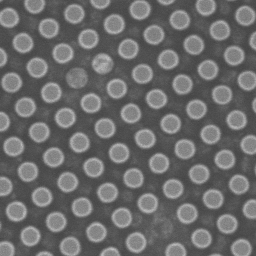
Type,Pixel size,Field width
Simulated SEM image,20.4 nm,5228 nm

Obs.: a regular array of raised bodies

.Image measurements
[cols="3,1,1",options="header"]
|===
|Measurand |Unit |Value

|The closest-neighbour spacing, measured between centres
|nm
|585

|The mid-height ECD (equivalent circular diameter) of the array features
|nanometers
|386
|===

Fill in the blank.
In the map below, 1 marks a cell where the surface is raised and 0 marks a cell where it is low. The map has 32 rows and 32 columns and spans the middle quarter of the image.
00000000011000000001100011110000
00000000111000000011110000000000
00000000000000000111110000000000
00000000000000000111110000001110
00000000000011100001100000011111
00000000000111100000000000011111
00000000000111100000001100001111
00000000000111100000011110000000
00000111100000000000011110000000
00001111100000000000011110000000
00001111100000011100001100000001
11000111000000111110000000000001
11000000000000111110000000000001
11100000000000011110000001111000
11000000111100001100000011111000
10000000111110000000000011111000
00000000111110000000100001110000
00011000111100000011110000000000
00111100000000000011111000000000
00111100000000000011111000000111
00111100000011100001110000001111
00011000000011110000000000001111
00000000000111110000000000001111
00000000000011110000001111000010
00000111100001000000011111000000
00000111110000000000011111000000
00000111110000001110001110000000
11000011100000011110000000000001
11100000000000011111000000000000
11100000000000011110000000111000
11100000011100001110000001111000
11000000011110000000000001111100